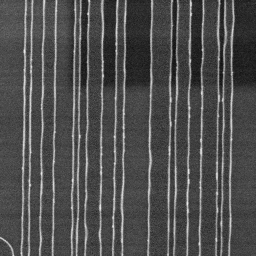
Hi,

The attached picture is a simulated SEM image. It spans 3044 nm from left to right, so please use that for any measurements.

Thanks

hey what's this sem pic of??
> groups of lines, slits or small figures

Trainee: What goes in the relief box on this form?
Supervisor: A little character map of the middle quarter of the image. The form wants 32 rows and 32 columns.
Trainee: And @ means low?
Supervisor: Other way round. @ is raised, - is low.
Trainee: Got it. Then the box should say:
---@--@@@@---@@-------@@@@@-@@@-
---@--@@@@---@@-------@@@@@-@@@@
---@--@@@@---@@-------@@@@@-@@@@
--@@--@@@@---@@-------@@@@@-@@@@
--@@--@@@@---@@-------@@@@--@@@-
---@--@@@@---@@-------@@@@--@@@-
--@@--@@@----@@-------@@@@@-@@@-
--@@--@@@----@@-------@@@@@-@@@-
--@@--@@@----@@-------@@@@@-@@@-
---@--@@@----@@-------@@@@@-@@@-
---@--@@@----@@-------@@@@@-@@@-
--@@--@@@----@@-------@@@@--@@@-
--@@--@@@----@@-------@@@@--@@@-
--@@--@@@----@@-------@@@@@-@@@-
--@@--@@@----@@-------@@@@@-@@@-
--@@--@@@----@@-------@@@@@-@@@-
--@@--@@@----@@-------@@@@@-@@@-
--@@--@@@----@@-------@@@@@-@@@-
--@@--@@@----@@-------@@@@@-@@@-
--@@--@@@----@@-------@@@@--@@@-
--@@--@@@----@@-------@@@@--@@@-
--@@--@@@----@@-------@@@@--@@@-
--@@--@@@----@@-------@@@@--@@@-
--@@--@@@----@@-------@@@@--@@@-
--@@--@@@----@@-------@@@@--@@@-
--@@--@@@----@@-------@@@@--@@@-
--@---@@@----@@------@@@@@--@@@-
--@---@@@----@@------@@@@@--@@@-
--@---@@@----@@------@@@@@--@@@-
--@---@@@----@@------@@@@@--@@@-
--@---@@@----@@-------@@@@--@@@-
--@---@@@----@@------@@@@@--@@@-